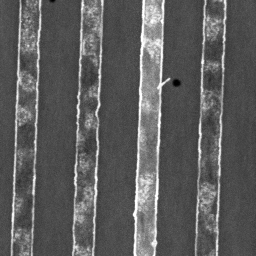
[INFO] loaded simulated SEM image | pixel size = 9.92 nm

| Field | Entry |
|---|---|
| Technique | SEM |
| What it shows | parallel lines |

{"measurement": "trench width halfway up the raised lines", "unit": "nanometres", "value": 400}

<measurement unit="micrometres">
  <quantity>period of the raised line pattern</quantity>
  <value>0.61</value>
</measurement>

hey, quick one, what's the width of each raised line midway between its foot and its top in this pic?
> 213 nm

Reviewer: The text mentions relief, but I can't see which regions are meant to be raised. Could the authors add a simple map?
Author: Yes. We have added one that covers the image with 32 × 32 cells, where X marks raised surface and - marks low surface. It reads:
---XX-----XXX-----XX------XX----
---XX-----XXX-----XX------XX----
---XX-----XXX-----XX------XX----
--XXX-----XXX-----XX-----XXX----
--XXX-----XXX-----XX-----XXX----
--XXX-----XXX-----XX-----XXX----
--XXX-----XXX-----XX-----XXX----
--XXX-----XXX-----XX-----XXX----
--XXX-----XXX-----XX-----XXX----
--XXX-----XXX-----XX-----XXX----
--XXX-----XX------XX-----XXX----
--XXX-----XX-----XXX-----XXX----
--XXX-----XX-----XXX-----XXX----
--XXX-----XX-----XXX-----XXX----
--XXX-----XX-----XXX-----XXX----
--XXX-----XX-----XXX-----XXX----
--XXX-----XX-----XXX-----XXX----
--XX------XX-----XXX-----XXX----
--XX------XX-----XXX-----XXX----
--XX------XX-----XXX-----XXX----
--XX-----XXX-----XXX-----XX-----
--XX-----XXX-----XXX-----XXX----
--XX-----XXX-----XXX-----XX-----
--XX-----XXX-----XXX-----XX-----
--XX-----XXX-----XXX-----XX-----
--XX-----XXX-----XXX-----XX-----
--XX-----XXX-----XXX-----XX-----
--XX-----XXX-----XX------XX-----
-XXX-----XXX-----XXX-----XX-----
-XXX-----XXX-----XXX-----XX-----
--XX-----XXX-----XX-----XXX-----
-XXX-----XXX-----XX-----XXX-----